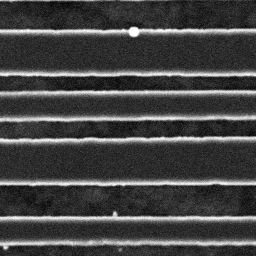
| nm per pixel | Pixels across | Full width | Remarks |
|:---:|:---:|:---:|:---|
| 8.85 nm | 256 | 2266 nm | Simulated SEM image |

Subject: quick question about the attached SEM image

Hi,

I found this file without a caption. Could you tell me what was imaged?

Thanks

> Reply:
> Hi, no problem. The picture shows lines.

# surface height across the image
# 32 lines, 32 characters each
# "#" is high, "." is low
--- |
................................
................................
................................
................................
################################
################################
################################
################################
################################
................................
................................
..................#.....########
################################
################################
################################
................................
................................
#.##############################
################################
################################
################################
################################
################################
................................
................................
................................
................................
################################
################################
################################
##.......................#.#.#..
................................